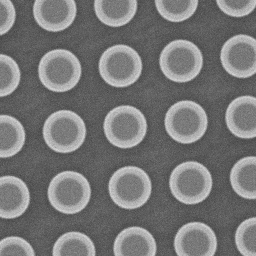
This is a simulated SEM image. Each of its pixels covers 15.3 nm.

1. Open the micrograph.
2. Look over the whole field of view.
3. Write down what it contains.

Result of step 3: an array of small figures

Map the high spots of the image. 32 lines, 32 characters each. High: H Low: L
HLLLHHHHHLLLHHHHHLLLHHHHHLLHHHHH
HHLLHHHHHLLLHHHHHLLLHHHHLLLLHHHL
HHLLLHHHHLLLLHHHLLLLLHHLLLLLLLLL
HLLLLLHHLLLLLLLLLLLLLLLLLLLLLLLL
LLLLLLLLLLLLLLLLLLLLLLLLLLLLLLHL
LLLLLLLLLLLLLLLLLLLLLHHHLLLLHHHH
LLLLLLHHHLLLLHHHHLLLHHHHHLLLHHHH
HHLLLHHHHHLLLHHHHHLLHHHHHLLLHHHH
HHLLLHHHHHLLHHHHHHLLHHHHHLLLHHHH
HHLLLHHHHHLLLHHHHLLLLHHHLLLLLHHL
HHLLLHHHHLLLLLHHLLLLLLLLLLLLLLLL
HLLLLLLLLLLLLLLLLLLLLLLLLLLLLLLL
LLLLLLLLLLLLLLLLLLLLLLLLLLLLLHHH
LLLLLLLLLLLLLLLHHLLLLHHHHLLLLHHH
HLLLLLHHHHLLLHHHHHLLLHHHHHLLHHHH
HHHLLLHHHHLLLHHHHHLLLHHHHHLLHHHH
HHHLLHHHHHHLLHHHHHLLLHHHHHLLLHHH
HHHLLLHHHHLLLLHHHHLLLLHHHLLLLLLL
HHHLLLHHHHLLLLLLLLLLLLLLLLLLLLLL
HLLLLLLLLLLLLLLLLLLLLLLLLLLLLLLL
LLLLLLLLLLLLLLLLLLLLLLLHHLLLLLHH
LLLLLLLLHLLLLLLHHHLLLLHHHHLLLHHH
HHHLLLLHHHHLLLHHHHHLLHHHHHLLLHHH
HHHLLLHHHHHLLLHHHHHLLHHHHHLLLHHH
HHHHLLHHHHHLLLHHHHHLLLHHHHLLLLHH
HHHLLLLHHHHLLLLHHHLLLLLLLLLLLLLL
HHHLLLLLHHLLLLLLLLLLLLLLLLLLLLLL
LLLLLLLLLLLLLLLLLLLLLLLLLLLLLLLH
LLLLLLLLLLLLLLLLHLLLLLLHHHLLLLHH
LLLLLLLLHHHLLLLHHHHLLLHHHHHLLHHH
HHHHLLLHHHHHLLHHHHHLLLHHHHHLLLHH
HHHHLLLHHHHHLLHHHHHLLLHHHHHLLLHH